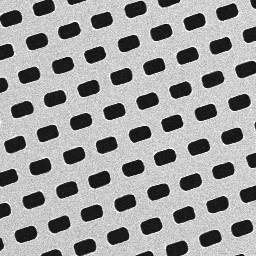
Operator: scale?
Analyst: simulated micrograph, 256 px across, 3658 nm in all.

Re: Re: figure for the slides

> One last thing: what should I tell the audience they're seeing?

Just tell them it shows a regular array of holes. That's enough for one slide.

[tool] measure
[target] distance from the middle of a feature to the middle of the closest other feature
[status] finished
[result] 0.486 microns